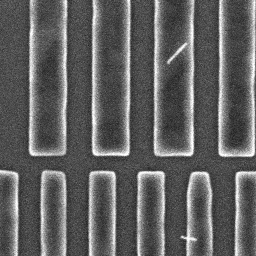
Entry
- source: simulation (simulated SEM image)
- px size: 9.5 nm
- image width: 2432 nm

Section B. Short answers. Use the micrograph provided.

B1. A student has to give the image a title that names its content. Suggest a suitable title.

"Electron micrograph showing wiring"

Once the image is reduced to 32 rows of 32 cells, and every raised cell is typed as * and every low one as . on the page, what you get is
....****....****....****....****
....****....****....****....****
....****....****...*****....****
....****....****...*****....****
....****....****...*****....****
....****....****...*****....****
....****....****...*****....****
....****....****...*****....****
....****....****...*****....****
....****....****...*****....****
....****....****...*****....****
....****....****...*****....****
....****....****...*****...*****
....****....****...*****...*****
....****....****...*****...*****
....****....****...*****...*****
....****....****...*****...*****
....****....****...*****...*****
....****....****...*****...*****
................................
................................
**....*.....**....*.............
**...***...***...***....**....**
**...***...***...***....**....**
**...***...***...***...***....**
**...***...***...***...***....**
**...***...***...***....**....**
**...***...***...***....**....**
**...***...***...***...***....**
**...***...***...***...***...***
**...***...***...***...***...***
**...***...***...***...***...***